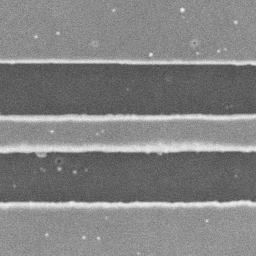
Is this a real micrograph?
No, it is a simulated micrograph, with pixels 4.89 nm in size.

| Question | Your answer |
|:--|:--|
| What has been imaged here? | lines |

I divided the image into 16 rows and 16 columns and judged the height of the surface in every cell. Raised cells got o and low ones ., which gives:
oooooooooooooooo
oooooooooooooooo
oooooooooooooooo
oooooooooooooooo
................
................
................
oooooooooooooooo
oooooooooooooooo
................
................
................
................
oooooooooooooooo
oooooooooooooooo
oooooooooooooooo